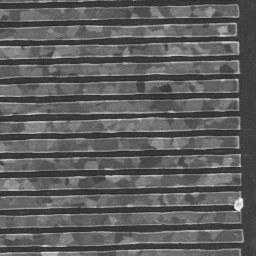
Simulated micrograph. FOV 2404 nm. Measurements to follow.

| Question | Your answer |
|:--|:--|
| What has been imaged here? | parallel lines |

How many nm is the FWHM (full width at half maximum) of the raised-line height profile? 112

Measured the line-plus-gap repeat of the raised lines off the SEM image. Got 18.8 pixels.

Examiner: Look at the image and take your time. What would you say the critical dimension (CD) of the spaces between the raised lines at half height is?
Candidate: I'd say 64.6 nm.